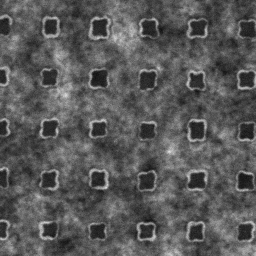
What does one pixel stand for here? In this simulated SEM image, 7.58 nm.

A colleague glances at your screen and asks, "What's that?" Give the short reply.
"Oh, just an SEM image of a regular array of raised bodies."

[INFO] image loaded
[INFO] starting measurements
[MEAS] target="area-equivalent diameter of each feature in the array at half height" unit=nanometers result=147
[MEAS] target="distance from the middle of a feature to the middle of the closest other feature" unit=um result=0.37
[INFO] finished